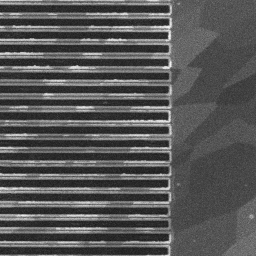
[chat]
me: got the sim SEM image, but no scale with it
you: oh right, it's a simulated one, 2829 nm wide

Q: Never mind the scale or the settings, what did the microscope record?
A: parallel lines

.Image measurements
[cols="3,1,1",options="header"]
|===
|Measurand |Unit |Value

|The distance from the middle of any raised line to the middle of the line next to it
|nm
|149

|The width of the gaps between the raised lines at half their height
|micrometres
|0.0953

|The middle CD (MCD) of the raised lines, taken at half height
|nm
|58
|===